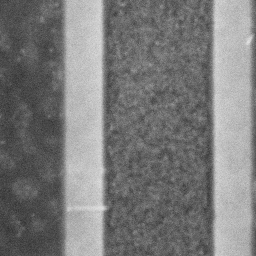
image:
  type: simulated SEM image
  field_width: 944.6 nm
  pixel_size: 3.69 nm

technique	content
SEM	one or a few lines or trenches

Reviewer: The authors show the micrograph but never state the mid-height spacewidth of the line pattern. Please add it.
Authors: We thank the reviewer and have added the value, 0.525 microns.